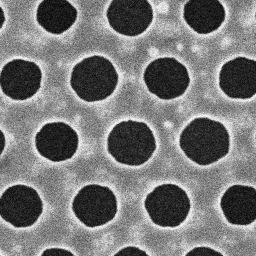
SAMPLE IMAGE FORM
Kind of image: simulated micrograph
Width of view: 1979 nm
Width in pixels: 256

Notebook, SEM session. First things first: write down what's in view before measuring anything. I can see holes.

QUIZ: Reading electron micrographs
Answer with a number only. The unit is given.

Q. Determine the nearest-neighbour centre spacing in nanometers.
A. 560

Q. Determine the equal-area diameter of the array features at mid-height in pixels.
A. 44.6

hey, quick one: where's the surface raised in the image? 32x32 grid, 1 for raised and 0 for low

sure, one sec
11111000011111000001111000001111
11111000001110000001111000001111
01111000011111000001111000001111
11111000011111000011111100011111
11111111111111110111111111111111
11111111111111111111111111111111
11111111111111111111111111111111
11011111110000111110001111111000
00000111100000111100000111110000
00000111100000011100000011100000
00000111100000011100000011100000
00000111100000111110000111110000
11011111110001111111111111111111
11111111111111111111111111111111
11111111111111111111111111111111
11111100111111100011111100001111
11111000011111000001111000000111
01110000001110000001110000000111
01110000001110000000111000000111
11111000011111000001111000001111
11111111111111100011111110111111
11111111111111111111111111111111
11111111111111111111111111111111
10001111110001111110000111111000
00000111100000111100000111110000
00000111100000011100000011110000
00000111100000011100000011110000
10000111110000111110000111110000
11111111111111111111111111111111
11111111111111111111111111111111
11111111111111111111111111111111
11111000011111100011111100011111